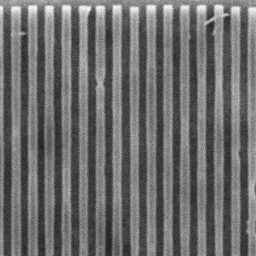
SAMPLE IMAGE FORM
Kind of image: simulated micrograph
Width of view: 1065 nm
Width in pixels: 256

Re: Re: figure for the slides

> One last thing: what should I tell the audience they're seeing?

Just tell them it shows parallel lines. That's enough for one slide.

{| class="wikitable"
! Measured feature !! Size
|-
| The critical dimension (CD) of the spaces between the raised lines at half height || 8.37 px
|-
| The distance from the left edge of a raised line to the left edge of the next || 70.2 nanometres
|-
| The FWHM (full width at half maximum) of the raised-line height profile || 34.8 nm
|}